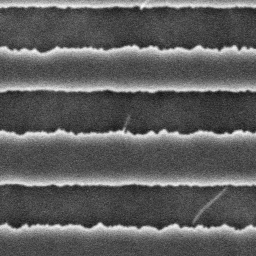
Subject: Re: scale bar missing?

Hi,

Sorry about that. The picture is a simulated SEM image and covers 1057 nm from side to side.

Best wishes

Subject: lines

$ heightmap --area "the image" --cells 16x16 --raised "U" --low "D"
DDDDDDDDDDDDDDDD
DDDDDDDDDDDDDDDD
DDDDDDDDDDDDDDDD
UUUUUUUUUUUUUUUU
UUUUUUUUUUUUUUUU
UUUUUUUUUUUUUUUU
DDDDDDDDDDDDDDDD
DDDDDDDDDDDDDDDD
UUUUUUUUUUUUUUUU
UUUUUUUUUUUUUUUU
UUUUUUUUUUUUUUUU
DUUUUUUUUUUUUUUU
DDDDDDDDDDDDDDDD
DDDDDDDDDDDDDDDD
UUUUUUUUUUUUUUUU
UUUUUUUUUUUUUUUU